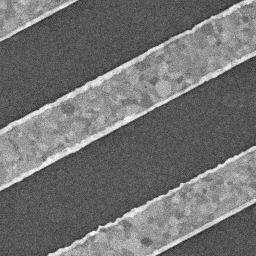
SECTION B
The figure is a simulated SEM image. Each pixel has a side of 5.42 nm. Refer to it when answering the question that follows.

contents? one or a few lines or trenches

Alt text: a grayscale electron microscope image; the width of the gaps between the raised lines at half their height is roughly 442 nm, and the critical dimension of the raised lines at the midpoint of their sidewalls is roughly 278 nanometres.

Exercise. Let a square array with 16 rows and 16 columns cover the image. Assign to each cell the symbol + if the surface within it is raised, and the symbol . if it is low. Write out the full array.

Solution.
++++...........+
++...........+++
...........+++++
.........+++++++
.......+++++++..
.....+++++++....
...+++++++......
.+++++++........
++++++..........
++++...........+
+++...........++
+...........++++
..........++++++
........++++++..
......++++++....
....++++++......